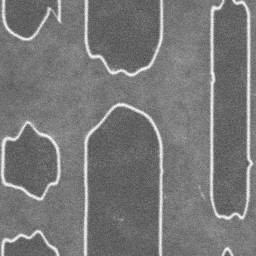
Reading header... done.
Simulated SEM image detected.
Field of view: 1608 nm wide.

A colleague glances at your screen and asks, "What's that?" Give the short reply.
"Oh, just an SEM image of one or a few lines or trenches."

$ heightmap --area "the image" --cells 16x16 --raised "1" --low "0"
1111011111000010
1110011111000111
0000011111000111
0000001111000111
0000000110000111
0000000000000111
0000000000000111
0000001110000111
0110001111000111
1111011111000111
1111011111000111
0110011111000110
0000011111000110
0000011111000010
0000011111000000
1110011111000000